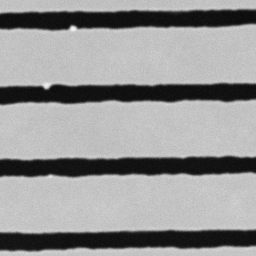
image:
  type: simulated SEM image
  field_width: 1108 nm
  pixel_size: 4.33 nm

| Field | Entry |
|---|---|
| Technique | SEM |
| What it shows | lines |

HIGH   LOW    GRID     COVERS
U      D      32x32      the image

UUUUUUUUUUUUUUUUUUUUUUUUUUUUUUUU
UUUUUUDDDDDDDDDDDDDDDDDDDDDDDDDD
DDDDDDDDDDDDDDDDDDDDDDDDDDDDDDDD
DDDDDDDDDUDDDDDDUUUUUUUUUUUUUUUU
UUUUUUUUUUUUUUUUUUUUUUUUUUUUUUUU
UUUUUUUUUUUUUUUUUUUUUUUUUUUUUUUU
UUUUUUUUUUUUUUUUUUUUUUUUUUUUUUUU
UUUUUUUUUUUUUUUUUUUUUUUUUUUUUUUU
UUUUUUUUUUUUUUUUUUUUUUUUUUUUUUUU
UUUUUUUUUUUUUUUUUUUUUUUUUUUUUUUU
UUUUUUUUUUUUUUUUUUUUUDDDDDDDDDDD
DDDDDDDDDDDDDDDDDDDDDDDDDDDDDDDD
DDDDDDDDDDDDDDDDDDDDDDDDDDDDDDDD
UUUUUUUUUUUUUUUUUUUUUUUUUUUUUUUU
UUUUUUUUUUUUUUUUUUUUUUUUUUUUUUUU
UUUUUUUUUUUUUUUUUUUUUUUUUUUUUUUU
UUUUUUUUUUUUUUUUUUUUUUUUUUUUUUUU
UUUUUUUUUUUUUUUUUUUUUUUUUUUUUUUU
UUUUUUUUUUUUUUUUUUUUUUUUUUUUUUUU
UUUUUUUUUUUUUUUUUUUUUUUUUUUUUUUU
DDDDDDDDDDDDDDDDDDDDDDDDDDDDDDDD
DDDDDDDDDDDDDDDDDDDDDDDDDDDDDDDD
UUUUUUUUUUUUUUUUUUUUUUUUUUUUUUUU
UUUUUUUUUUUUUUUUUUUUUUUUUUUUUUUU
UUUUUUUUUUUUUUUUUUUUUUUUUUUUUUUU
UUUUUUUUUUUUUUUUUUUUUUUUUUUUUUUU
UUUUUUUUUUUUUUUUUUUUUUUUUUUUUUUU
UUUUUUUUUUUUUUUUUUUUUUUUUUUUUUUU
UUUUUUUUUUUUUUUUUUUUUUUUUUUUUUUU
DDDDDDDDDDDDDDDDDDDDDDDDDDDDDDDD
DDDDDDDDDDDDDDDDDDDDDDDDDDDDDDDD
UUUUUUUUUUUUUUUUUUUUUUUUUUUUUUUU